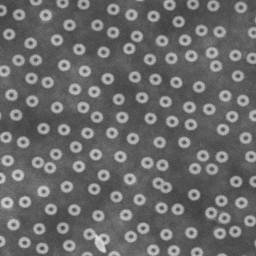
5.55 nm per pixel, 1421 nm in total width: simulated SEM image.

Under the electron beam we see a regular array of ring-shaped raised bodies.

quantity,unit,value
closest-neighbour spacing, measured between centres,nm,103